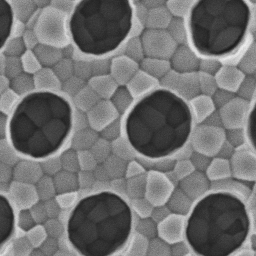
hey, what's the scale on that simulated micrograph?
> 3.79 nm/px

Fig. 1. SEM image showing holes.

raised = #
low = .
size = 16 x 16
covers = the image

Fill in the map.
.####...####....
.###....####...#
#####...####...#
################
################
################
#...#####...####
#...####....####
#...####....####
#..######..#####
################
################
#####...#####..#
.###....####...#
.###....####...#
#####..#####...#